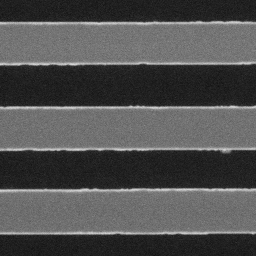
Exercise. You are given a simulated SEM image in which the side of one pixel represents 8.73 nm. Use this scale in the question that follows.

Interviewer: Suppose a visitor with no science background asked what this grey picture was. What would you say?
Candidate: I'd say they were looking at lines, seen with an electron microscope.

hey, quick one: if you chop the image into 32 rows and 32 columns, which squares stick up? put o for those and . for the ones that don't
................................
................................
................................
oooooooooooooooooooooooooooooooo
oooooooooooooooooooooooooooooooo
oooooooooooooooooooooooooooooooo
oooooooooooooooooooooooooooooooo
oooooooooooooooooooooooooooooooo
................................
................................
................................
................................
................................
oooooooooooooooooooooooooooooooo
oooooooooooooooooooooooooooooooo
oooooooooooooooooooooooooooooooo
oooooooooooooooooooooooooooooooo
oooooooooooooooooooooooooooooooo
oooooooooooooooooooooooooooooooo
................................
................................
................................
................................
................................
oooooooooooooooooooooooooooooooo
oooooooooooooooooooooooooooooooo
oooooooooooooooooooooooooooooooo
oooooooooooooooooooooooooooooooo
oooooooooooooooooooooooooooooooo
................................
................................
................................